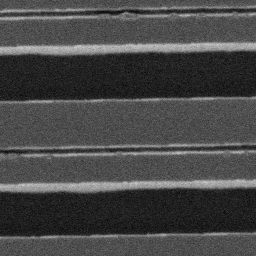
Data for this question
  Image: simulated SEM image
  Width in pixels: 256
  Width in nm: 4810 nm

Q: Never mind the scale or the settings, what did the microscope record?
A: lines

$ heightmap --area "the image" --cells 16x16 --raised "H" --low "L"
HHHHHHHHHHHHHHHH
HHHHHHHHHHHHHHHH
HHHHHHHHHHHHHHHH
LLLLLLLLLLLLLLLL
LLLLLLLLLLLLLLLL
LLLLLLLLLLLLLLLL
HHHHHHHHHHHHHHHH
HHHHHHHHHHHHHHHH
HHHHHHHHHHHHHHHH
HHHHHHHHHHHHHHHH
HHHHHHHHHHHHHHHH
HHHHHHHHLLLLLLLL
LLLLLLLLLLLLLLLL
LLLLLLLLLLLLLLLL
LLLLLLLLLLLLLLLL
HHHHHHHHHHHHHHHH